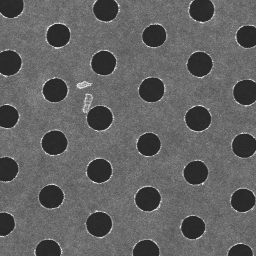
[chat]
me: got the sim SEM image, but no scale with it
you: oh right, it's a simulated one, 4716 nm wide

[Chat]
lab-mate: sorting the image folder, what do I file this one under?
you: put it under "a regular array of holes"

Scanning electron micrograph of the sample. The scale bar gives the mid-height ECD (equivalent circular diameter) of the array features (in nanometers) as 454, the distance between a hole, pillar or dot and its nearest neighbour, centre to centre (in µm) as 0.982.